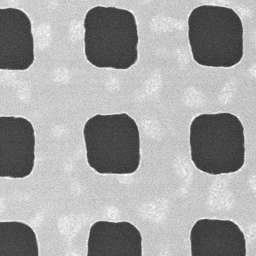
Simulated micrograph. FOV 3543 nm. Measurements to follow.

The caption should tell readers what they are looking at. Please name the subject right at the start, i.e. holes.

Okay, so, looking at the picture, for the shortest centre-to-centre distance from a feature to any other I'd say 1450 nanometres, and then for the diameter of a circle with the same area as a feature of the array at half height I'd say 851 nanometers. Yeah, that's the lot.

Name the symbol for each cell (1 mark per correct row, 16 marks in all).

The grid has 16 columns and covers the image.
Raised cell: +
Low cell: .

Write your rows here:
.+++++.+++++..++
..+++....+++...+
..+++....+++...+
..+++....+++...+
++++++++++++++++
++++++++++++++++
++++++++++++++++
..++++..++++...+
..+++....+++...+
..+++....+++...+
..++++...+++...+
++++++++++++++++
++++++++++++++++
++++++++++++++++
..++++...+++...+
..+++....+++...+